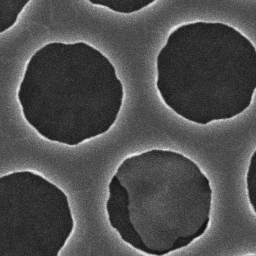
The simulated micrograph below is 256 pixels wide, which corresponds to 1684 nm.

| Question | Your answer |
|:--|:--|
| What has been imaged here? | holes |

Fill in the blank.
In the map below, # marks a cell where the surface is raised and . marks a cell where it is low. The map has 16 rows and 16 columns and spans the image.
.######..#######
.###########..##
##########......
##.....###......
##.....###......
#.......##......
#.......##......
##.....#####..##
###...##########
#########..#####
#######.....####
...####......##.
....###......###
....###......###
....###......###
....####...#####